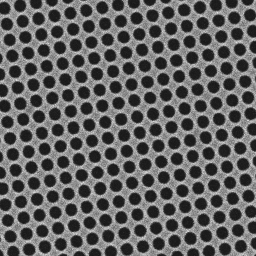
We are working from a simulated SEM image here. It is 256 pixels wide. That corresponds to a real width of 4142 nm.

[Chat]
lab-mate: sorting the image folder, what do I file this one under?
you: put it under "a regular array of holes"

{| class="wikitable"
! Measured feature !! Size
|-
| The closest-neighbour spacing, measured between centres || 258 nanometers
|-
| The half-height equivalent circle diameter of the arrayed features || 0.206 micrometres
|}